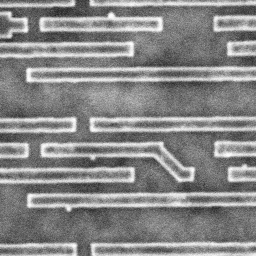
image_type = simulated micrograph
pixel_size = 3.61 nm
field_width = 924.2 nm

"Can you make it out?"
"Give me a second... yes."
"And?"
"wiring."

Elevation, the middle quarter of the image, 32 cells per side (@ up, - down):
--------------------------------
@@@@@@@@@@@@@@@@@@@@@@@@@@@@@@@@
@@@@@@@@@@@@@@@@@@@@@@@@@@@@@@@@
@@@@@@@@@@@@@@@@@@@@@@@@@@@@@@@@
--------------------------------
--------------------------------
--------------------------------
--------------------------------
--------------------------------
--------------------------------
--------------------------------
--------------------------------
--------------------------------
--------------------------------
@@@----@@@@@@@@@@@@@@@@@@@@@@@@@
@@@----@@@@@@@@@@@@@@@@@@@@@@@@@
@@@----@@@@@@@@@@@@@@@@@@@@-----
--------------------------------
--------------------------------
--------------------------------
@@@@@@@@@@@@@@@@@@@@@@@@@-------
@@@@@@@@@@@@@@@@@@@@@@@@@@------
@@@@@@@@@@@@@@@@@@@@@@@@@@------
-----------------------@@@@-----
------------------------@@@@----
-------------------------@@@@---
@@@@@@@@@@@@@@@@@---------@@@@@@
@@@@@@@@@@@@@@@@@----------@@@@@
@@@@@@@@@@@@@@@@@-----------@@@@
--------------------------------
--------------------------------
--------------------------------